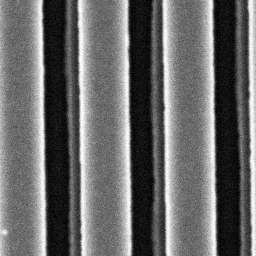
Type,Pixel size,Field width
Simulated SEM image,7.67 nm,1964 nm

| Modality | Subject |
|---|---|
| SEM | lines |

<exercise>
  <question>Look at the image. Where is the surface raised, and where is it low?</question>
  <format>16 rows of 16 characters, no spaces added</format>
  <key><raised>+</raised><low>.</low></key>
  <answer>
+++..+++..+++...
+++..+++..+++...
+++..+++..+++...
+++..+++..+++...
+++..+++..+++...
+++..+++..+++...
+++..+++..+++...
+++..+++..+++...
+++..+++..+++...
+++..+++..+++...
+++..+++..+++...
+++..+++..+++...
+++..+++..+++...
+++..+++..+++...
+++..+++..+++...
+++..+++..+++...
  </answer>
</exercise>